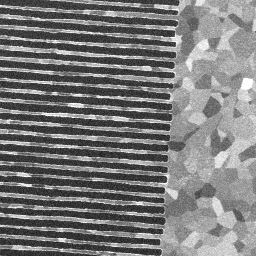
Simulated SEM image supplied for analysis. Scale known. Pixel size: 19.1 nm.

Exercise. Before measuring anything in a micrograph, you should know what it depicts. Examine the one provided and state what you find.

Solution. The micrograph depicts parallel lines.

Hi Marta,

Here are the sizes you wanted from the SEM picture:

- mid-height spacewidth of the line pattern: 140 nm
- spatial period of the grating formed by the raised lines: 198 nm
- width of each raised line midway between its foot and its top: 61.7 nanometers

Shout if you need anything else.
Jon